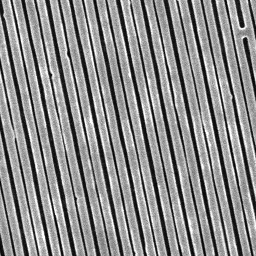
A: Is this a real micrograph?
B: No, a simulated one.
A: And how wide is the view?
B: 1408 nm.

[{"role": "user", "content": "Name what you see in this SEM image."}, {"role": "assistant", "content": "parallel lines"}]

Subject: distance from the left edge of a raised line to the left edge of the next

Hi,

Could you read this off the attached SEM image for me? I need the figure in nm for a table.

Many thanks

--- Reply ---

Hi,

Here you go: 64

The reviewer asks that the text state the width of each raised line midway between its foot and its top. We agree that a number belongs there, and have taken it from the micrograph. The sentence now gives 0.0432 um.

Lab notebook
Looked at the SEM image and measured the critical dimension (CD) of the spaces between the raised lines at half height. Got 19.6 nm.